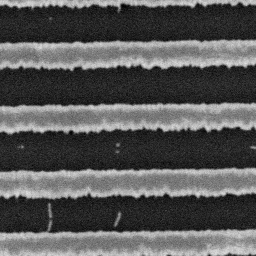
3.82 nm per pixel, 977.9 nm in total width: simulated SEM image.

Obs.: lines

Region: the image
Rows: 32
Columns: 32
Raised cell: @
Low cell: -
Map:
@@@@@@@@@@@@@@@-@@@@@@@@@@----@@
--------------------------------
--------------------------------
--------------------------------
--------------------------------
---------@@@@@@@@@@@@@@@@@@@@@@@
@@@@@@@@@@@@@@@@@@@@@@@@@@@@@@@@
@@@@@@@@@@@@@@@@@@@@@@@@@@@@@@@@
--------@-----------------------
--------------------------------
--------------------------------
--------------------------------
--------------------------------
@-@@@@@@@@@@@@@@@@@@@@@@@@@@@@@@
@@@@@@@@@@@@@@@@@@@@@@@@@@@@@@@@
@@@@@@@@@@@@@@@@@@@@@@@@@@@@@@@@
--------------------------------
--------------------------------
--------------------------------
--------------------------------
--------------------------------
-------@@-@@@@@@@@@@@@@@@@@@@@@@
@@@@@@@@@@@@@@@@@@@@@@@@@@@@@@@@
@@@@@@@@@@@@@@@@@@@@@@@@@@@@@@@@
@--@@@@@@@--@@------------@-----
--------------------------------
--------------------------------
--------------------------------
--------------------------------
@@@@@@@@@@@@@@@@@@@@@@@@@@@@@@@@
@@@@@@@@@@@@@@@@@@@@@@@@@@@@@@@@
@@@@@@@@@@@@@@@@@@@@@@@@@@@@-@@@